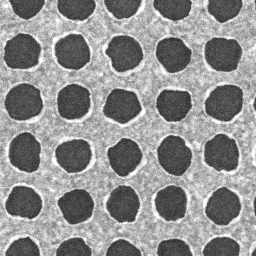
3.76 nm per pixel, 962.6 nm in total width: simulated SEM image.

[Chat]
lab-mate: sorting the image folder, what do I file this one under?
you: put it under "a regular array of holes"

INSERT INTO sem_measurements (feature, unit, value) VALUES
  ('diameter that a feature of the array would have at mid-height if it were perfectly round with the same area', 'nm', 140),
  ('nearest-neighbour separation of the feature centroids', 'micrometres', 0.184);